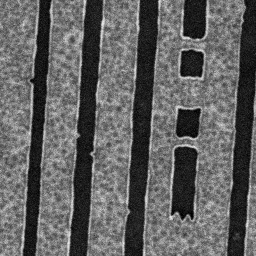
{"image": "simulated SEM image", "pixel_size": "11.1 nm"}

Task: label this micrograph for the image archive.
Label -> parallel lines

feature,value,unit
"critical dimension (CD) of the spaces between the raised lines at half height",0.214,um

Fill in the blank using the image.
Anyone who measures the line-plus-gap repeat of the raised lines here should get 580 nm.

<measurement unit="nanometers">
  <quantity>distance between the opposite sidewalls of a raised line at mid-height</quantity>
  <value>377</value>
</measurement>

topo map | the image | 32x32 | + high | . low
+++++.+++++..++++...+++...+++++.
+++++.++++...++++...+++...++++..
+++++.++++...++++...+++...++++..
++++..++++...++++...+++...++++..
++++..++++...++++...+++...++++..
++++..++++...++++...++++++++++..
++++..++++...++++...+++..+++++..
++++..++++...++++...++....++++..
++++..++++..+++++..+++....++++..
++++..++++..+++++..++++..+++++..
++++..++++..+++++..+++++++++++..
++++..++++..+++++..+++++++++++..
++++..++++..+++++..+++++++++++..
++++..++++..+++++..+++.+.++++...
++++..++++..++++...+++...++++...
++++..++++..++++...+++...++++...
++++..++++..++++...+++...++++...
++++..++++..++++...++++++++++...
++++.++++...++++...+++..+++++..+
+++..++++...++++...+++...++++..+
++++.++++...++++...+++...++++..+
+++..++++...++++...+++...++++..+
+++..++++...++++...++....++++..+
+++..++++...++++..+++...+++++..+
+++..++++..+++++..+++...+++++..+
+++..++++..+++++..+++...+++++..+
+++..++++..+++++..+++...+++++..+
+++..++++..+++++..+++++++++++..+
+++..++++..+++++..+++++++++++..+
+++..++++..++++...++++++++++...+
+++..++++..++++...++++++++++...+
+++..+++...++++...++++++++++...+